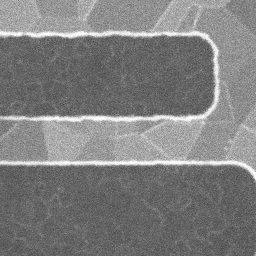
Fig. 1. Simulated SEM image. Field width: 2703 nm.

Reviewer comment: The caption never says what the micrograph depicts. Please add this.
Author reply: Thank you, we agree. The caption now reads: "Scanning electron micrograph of one or a few lines or trenches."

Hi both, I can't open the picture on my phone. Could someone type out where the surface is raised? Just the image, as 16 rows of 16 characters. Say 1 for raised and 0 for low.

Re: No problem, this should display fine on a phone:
1111111111111111
1111111111111111
0000000000000111
0000000000000111
0000000000000011
0000000000000011
0000000000000111
1111111111111111
1111111111111111
1111111111111111
0000000000000001
0000000000000000
0000000000000000
0000000000000000
0000000000000000
0000000000000000